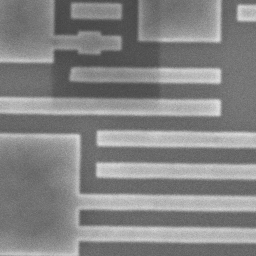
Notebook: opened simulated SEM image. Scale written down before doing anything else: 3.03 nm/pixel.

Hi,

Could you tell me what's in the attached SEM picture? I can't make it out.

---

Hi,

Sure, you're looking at wiring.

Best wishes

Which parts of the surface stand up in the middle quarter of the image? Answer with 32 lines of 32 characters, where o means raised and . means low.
................................
..oooooooooooooooooooooooooooooo
..oooooooooooooooooooooooooooooo
.ooooooooooooooooooooooooooooooo
................................
................................
................................
................................
................................
oooooooooooooooooooooooooooooooo
oooooooooooooooooooooooooooooooo
oooooooooooooooooooooooooooooooo
............oooooooooooooooooooo
................................
................................
................................
................................
........oooooooooooooooooooooooo
oooo....oooooooooooooooooooooooo
oooo....oooooooooooooooooooooooo
oooo............................
oooo............................
oooo............................
oooo............................
oooo............................
oooo....oooooooooooooooooooooooo
oooo....oooooooooooooooooooooooo
oooo....oooooooooooooooooooooooo
oooo............................
oooo............................
oooo............................
oooo............................